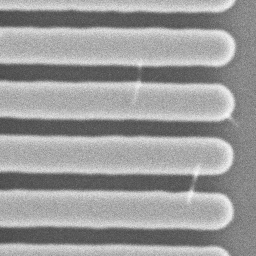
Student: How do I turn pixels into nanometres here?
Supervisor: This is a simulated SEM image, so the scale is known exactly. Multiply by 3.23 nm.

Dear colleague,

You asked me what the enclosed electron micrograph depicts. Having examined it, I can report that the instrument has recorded groups of lines, slits or small figures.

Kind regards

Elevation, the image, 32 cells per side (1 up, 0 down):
11111111111111111111111111111000
00000000000000000000100000000000
00000000000000000000000000000000
00000000000000000000000000000000
11111111111111111111111111111000
11111111111111111111111111111000
11111111111111111111111111111000
11111111111111111111111111111000
00000000000000000000000000000000
00000000000000000000000000000000
11111111111111111110000000000000
11111111111111111111111111111000
11111111111111111111111111111000
11111111111111111111111111111000
11111111111111111111111111111000
00000000000000000000000000000000
00000000000000000000000000000000
11111111111111111111111111110000
11111111111111111111111111111000
11111111111111111111111111111000
11111111111111111111111111111000
00011111111111111111111111110000
00000000000000000000000000000000
00000000000000000000000000000000
11111111111111111111111111110000
11111111111111111111111111111000
11111111111111111111111111111000
11111111111111111111111111111000
00000000000000000011000111100000
00000000000000000000000000000000
00000000000000000000000000000000
11111111111111111111111111110000